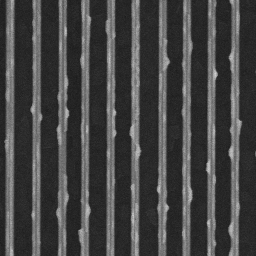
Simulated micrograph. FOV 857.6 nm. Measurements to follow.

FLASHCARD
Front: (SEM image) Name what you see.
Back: parallel lines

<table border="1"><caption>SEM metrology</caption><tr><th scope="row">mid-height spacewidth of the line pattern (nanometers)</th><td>59.1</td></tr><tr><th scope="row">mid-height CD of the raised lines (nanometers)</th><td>22.6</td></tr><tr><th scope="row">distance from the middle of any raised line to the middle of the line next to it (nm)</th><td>83.8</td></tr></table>